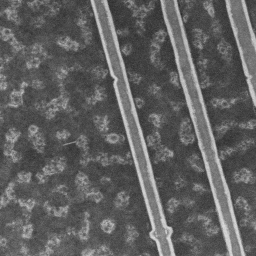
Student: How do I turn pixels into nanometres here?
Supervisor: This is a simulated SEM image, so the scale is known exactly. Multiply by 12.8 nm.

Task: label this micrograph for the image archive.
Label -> one or a few lines or trenches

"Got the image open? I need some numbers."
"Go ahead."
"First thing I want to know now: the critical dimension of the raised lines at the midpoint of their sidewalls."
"171 nm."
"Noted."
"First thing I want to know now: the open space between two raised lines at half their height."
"686 nm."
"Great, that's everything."